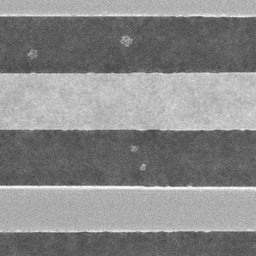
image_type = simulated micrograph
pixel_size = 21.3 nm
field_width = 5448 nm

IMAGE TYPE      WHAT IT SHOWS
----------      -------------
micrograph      lines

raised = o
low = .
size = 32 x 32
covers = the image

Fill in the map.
oooooooooooooooooooooooooooooooo
oooooooooooooooooooooooooooooooo
................................
................................
................................
................................
................................
................................
................................
oooooooooooooooooooooooooooooooo
oooooooooooooooooooooooooooooooo
oooooooooooooooooooooooooooooooo
oooooooooooooooooooooooooooooooo
oooooooooooooooooooooooooooooooo
oooooooooooooooooooooooooooooooo
oooooooooooooooooooooooooooooooo
................................
................................
................................
................................
................................
................................
................................
oooooooooooooooooooooooooooooooo
oooooooooooooooooooooooooooooooo
oooooooooooooooooooooooooooooooo
oooooooooooooooooooooooooooooooo
oooooooooooooooooooooooooooooooo
oooooooooooooooooooooooooooooooo
................................
................................
................................